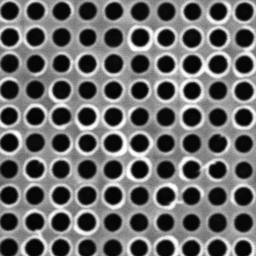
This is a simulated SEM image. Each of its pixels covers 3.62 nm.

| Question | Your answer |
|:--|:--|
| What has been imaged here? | a regular array of holes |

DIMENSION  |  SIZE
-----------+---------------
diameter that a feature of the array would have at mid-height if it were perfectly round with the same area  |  66.5 nm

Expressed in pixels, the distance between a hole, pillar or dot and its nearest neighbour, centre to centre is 26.